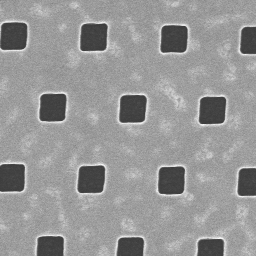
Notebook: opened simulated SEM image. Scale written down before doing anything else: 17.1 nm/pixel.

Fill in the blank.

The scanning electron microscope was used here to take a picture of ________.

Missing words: holes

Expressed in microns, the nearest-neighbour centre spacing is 1.37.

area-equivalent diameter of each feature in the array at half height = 510 nanometres